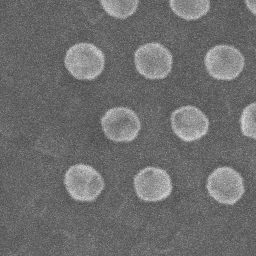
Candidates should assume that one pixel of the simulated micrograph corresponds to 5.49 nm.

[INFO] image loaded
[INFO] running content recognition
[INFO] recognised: a regular array of raised bodies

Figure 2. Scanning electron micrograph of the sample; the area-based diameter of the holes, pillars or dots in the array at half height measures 197 nanometers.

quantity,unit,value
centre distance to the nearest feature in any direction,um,0.378